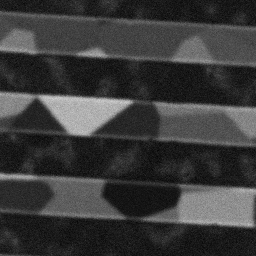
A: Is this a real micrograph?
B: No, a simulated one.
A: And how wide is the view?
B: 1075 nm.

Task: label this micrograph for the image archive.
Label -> one or a few lines or trenches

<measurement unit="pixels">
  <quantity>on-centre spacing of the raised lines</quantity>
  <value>80.5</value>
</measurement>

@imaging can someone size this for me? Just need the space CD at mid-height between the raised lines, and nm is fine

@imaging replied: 182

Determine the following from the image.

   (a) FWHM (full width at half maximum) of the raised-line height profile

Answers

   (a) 158 nanometers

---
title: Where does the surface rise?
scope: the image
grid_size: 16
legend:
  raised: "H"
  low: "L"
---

LLLLLLLLLLLLLLLL
HHHHHHHHHHHHLLLL
HHHHHHHHHHHHHHHH
LLLLLLHHHHHHHHHH
LLLLLLLLLLLLLLLL
LLLLLLLLLLLLLLLL
HHHHHHHHHHHLLLLL
HHHHHHHHHHHHHHHH
LLLLLLHHHHHHHHHH
LLLLLLLLLLLLLLLL
LLLLLLLLLLLLLLLL
HHHHHHHHHHLLLLLL
HHHHHHHHHHHHHHHH
LLLLLHHHHHHHHHHH
LLLLLLLLLLLLLLLL
LLLLLLLLLLLLLLLL